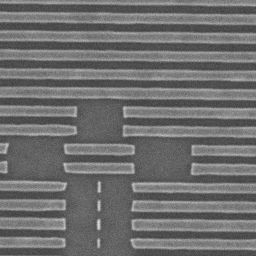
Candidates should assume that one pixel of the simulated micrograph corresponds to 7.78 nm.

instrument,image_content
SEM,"wiring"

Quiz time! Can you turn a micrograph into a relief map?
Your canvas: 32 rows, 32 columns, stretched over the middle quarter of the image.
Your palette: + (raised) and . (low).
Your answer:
................................
++++++++........................
++++++++++++++++++++++++++++++++
++++++++++++++++++++++++++++++++
................................
................................
++++++++++++++++++++++++++++++++
++++++++++++++++++++++++++++++++
.............+++++++++++++++++++
................................
................................
+++............+++++++++++++++++
+++............+++++++++++++++++
................................
................................
................................
+++............+++++++++++++++++
+++............+++++++++++++++++
................................
................................
+++++++++++++++++...............
+++++++++++++++++...............
............++++................
................................
................................
+++++++++++++++++...............
+++++++++++++++++...............
................................
................................
................................
.................+++++++++++++++
.................+++++++++++++++